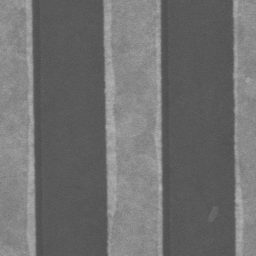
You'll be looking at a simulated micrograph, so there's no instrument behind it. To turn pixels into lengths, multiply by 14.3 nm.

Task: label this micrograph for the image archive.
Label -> lines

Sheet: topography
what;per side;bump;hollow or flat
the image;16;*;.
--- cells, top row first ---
**.....***.....*
**.....***.....*
**.....***.....*
**.....***.....*
**.....***.....*
**.....***.....*
**.....***.....*
**.....***.....*
**.....***.....*
**.....***.....*
**.....***.....*
**.....***.....*
**.....***.....*
**.....***.....*
**.....***.....*
**.....***.....*